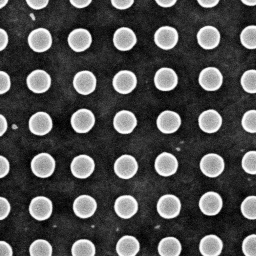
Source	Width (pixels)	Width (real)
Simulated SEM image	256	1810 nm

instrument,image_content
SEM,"a regular array of raised bodies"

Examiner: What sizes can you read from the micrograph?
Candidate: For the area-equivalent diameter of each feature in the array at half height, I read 154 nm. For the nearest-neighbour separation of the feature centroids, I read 284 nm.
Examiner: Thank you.